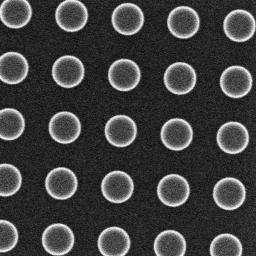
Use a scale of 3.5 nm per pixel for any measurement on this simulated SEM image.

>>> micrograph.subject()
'an array of small figures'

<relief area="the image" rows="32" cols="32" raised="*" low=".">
****....**.....**...............
****...****...****...***.....**.
****...****...****...****...****
........**....***....****...****
......................**.....**.
................................
................................
***....***.....*................
***....***....***....***.....**.
***....***....***....***....***.
.......***....***....***....***.
......................*.....***.
................................
................................
***....**.....**................
***...****...****....***....**..
***...****...****...****...****.
.......**.....***...****...****.
.....................**.....***.
................................
................................
**....***.....*.................
***...****...***....***.....**..
**....****...****...****...***..
......***....***....***....****.
.....................**....***..
................................
................................
**....***.....*.................
**...****....***....***....**...
**...****...****...****...****..
......**.....***...****...****..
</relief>